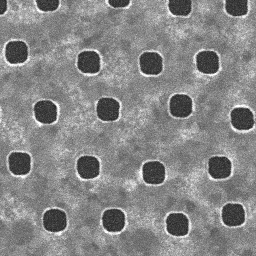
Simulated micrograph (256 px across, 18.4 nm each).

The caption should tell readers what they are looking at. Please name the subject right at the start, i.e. a regular array of holes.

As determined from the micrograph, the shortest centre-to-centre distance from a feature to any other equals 1010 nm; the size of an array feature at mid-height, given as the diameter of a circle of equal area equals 468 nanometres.